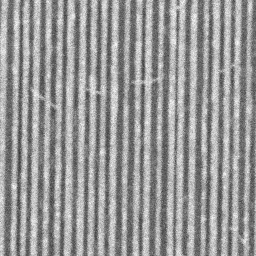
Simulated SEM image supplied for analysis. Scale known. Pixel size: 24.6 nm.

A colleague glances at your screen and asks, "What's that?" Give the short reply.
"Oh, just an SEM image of parallel lines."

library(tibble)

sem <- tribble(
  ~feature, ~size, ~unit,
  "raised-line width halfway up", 129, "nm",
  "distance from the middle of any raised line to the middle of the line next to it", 274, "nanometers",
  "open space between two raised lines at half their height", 148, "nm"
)